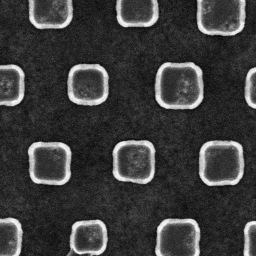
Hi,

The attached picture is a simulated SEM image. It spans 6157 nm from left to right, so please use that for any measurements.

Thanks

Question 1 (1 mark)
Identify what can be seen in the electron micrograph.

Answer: raised bodies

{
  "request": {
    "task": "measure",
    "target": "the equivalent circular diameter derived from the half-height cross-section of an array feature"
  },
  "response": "1010 nm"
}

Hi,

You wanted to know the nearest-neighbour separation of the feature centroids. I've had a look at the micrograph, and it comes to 86.9 pixels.